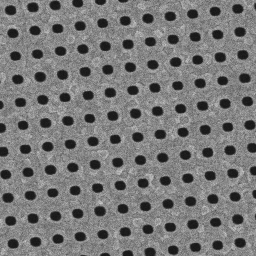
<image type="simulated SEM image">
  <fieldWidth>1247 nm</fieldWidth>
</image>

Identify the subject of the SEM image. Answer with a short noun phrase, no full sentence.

a regular array of holes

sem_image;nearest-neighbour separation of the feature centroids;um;0.109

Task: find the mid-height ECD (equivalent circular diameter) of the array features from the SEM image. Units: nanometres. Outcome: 48.5